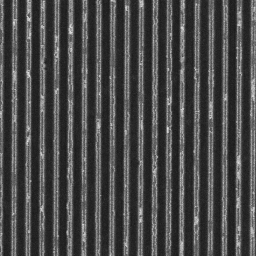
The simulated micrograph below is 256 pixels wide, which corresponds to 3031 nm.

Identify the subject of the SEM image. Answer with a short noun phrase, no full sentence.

parallel lines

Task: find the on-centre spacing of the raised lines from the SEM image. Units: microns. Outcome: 0.166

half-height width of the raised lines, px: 5.75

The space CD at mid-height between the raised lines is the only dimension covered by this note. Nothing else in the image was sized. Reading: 91.8 nm